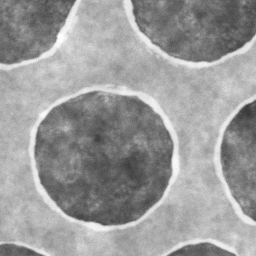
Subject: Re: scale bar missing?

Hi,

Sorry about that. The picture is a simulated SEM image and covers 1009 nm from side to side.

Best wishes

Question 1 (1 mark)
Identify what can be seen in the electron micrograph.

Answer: holes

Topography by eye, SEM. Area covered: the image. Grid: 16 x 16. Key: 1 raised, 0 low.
0000011100000000
0000111100000000
0000111110000000
0001111111100011
1111111111111111
1111111111111111
1111000000111110
1100000000111100
1100000000011100
1100000000011100
1100000000011100
1100000000011100
1110000000111110
1111000001111110
1111111111111111
0011111111100011